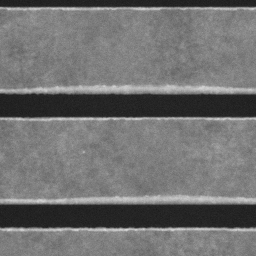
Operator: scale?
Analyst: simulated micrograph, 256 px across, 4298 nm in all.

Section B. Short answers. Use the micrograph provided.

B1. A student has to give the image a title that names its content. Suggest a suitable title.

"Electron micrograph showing lines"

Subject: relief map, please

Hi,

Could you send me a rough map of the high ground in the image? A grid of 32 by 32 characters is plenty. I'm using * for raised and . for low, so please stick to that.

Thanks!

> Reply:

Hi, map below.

................................
********************************
********************************
********************************
********************************
********************************
********************************
********************************
********************************
********************************
********************************
********..................******
................................
................................
................................
********************************
********************************
********************************
********************************
********************************
********************************
********************************
********************************
********************************
********************************
................................
................................
................................
................................
********************************
********************************
********************************